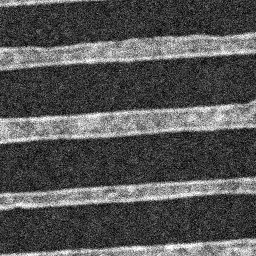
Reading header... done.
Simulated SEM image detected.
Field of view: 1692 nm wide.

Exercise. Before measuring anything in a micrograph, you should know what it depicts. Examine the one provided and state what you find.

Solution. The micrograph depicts one or a few lines or trenches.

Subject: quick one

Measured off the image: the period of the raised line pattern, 0.469 microns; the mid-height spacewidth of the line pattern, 348 nanometers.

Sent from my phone